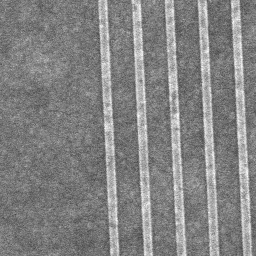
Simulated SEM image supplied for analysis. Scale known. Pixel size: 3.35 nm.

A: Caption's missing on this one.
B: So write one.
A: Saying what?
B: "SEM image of parallel lines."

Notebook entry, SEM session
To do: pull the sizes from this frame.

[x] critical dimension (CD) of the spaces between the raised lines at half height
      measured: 85.8 nanometres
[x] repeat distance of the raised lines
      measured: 0.111 micrometres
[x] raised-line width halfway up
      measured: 25.5 nanometres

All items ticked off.